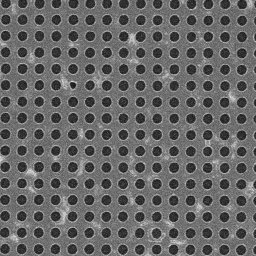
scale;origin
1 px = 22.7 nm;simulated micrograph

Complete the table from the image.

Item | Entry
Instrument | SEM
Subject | a regular array of holes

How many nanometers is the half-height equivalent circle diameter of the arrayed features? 238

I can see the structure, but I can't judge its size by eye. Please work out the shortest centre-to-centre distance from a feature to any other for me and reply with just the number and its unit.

369 nanometers